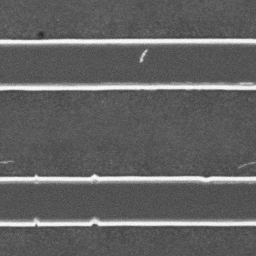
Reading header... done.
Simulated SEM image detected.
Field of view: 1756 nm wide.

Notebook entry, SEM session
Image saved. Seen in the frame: one or a few lines or trenches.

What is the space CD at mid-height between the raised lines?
625 nm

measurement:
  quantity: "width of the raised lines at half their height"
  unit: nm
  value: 313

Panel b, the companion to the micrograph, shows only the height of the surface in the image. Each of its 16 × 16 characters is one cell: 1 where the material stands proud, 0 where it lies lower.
0000000000000000
0000000000000000
0000000000000000
1111111111111111
1111111111111111
0000000000000000
0000000000000000
0000000000000000
0000000000000000
0000000000000000
0000000000000000
1111111111111111
1111111111111111
1111111111111111
0000000000000000
0000000000000000